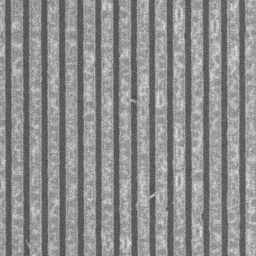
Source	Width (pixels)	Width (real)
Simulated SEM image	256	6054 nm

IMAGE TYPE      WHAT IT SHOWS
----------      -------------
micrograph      parallel lines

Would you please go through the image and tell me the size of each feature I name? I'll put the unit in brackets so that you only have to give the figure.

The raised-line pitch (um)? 0.425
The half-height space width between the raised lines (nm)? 166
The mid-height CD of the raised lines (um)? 0.269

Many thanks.